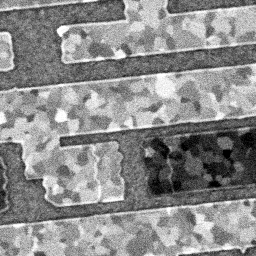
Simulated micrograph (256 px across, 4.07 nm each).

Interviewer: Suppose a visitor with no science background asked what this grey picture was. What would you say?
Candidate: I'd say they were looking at one or a few lines or trenches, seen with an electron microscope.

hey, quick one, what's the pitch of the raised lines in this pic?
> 264 nanometers